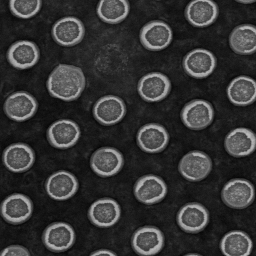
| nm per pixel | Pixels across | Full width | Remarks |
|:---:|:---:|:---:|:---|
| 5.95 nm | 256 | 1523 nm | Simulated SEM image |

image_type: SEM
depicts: a regular array of raised bodies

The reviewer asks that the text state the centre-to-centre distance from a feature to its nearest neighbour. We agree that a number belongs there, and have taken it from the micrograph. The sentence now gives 303 nanometers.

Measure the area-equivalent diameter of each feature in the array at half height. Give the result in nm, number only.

179